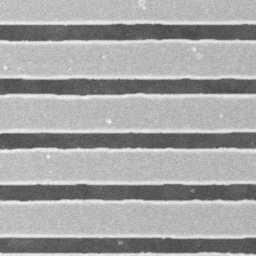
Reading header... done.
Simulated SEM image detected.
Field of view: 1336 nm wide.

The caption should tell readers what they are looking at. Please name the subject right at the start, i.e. lines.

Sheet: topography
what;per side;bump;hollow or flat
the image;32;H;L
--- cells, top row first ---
HHHHHHHHHHHHHHHHHHHHHHHHHHHHHHHH
HHHHHHHHHHHHHHHHHHHHHHHHHHHHHHHH
HHHHHHHHHHHHHHHHHHHHHHHHHHHHHHHH
LLLLLLLLLLLLLLLLLLLLLLLLLLLLLLLL
LLLLLLLLLLLLLLLLLLLLLLLLLLLLLLLL
HHHHHHHHHHHHHHHHHHHHHHHHHHHHHHHH
HHHHHHHHHHHHHHHHHHHHHHHHHHHHHHHH
HHHHHHHHHHHHHHHHHHHHHHHHHHHHHHHH
HHHHHHHHHHHHHHHHHHHHHHHHHHHHHHHH
HHHHHHHHHHHHHHHHHHHHHHHHHHHHHHHH
LLLLLLLLLLLLLLLLLLLLLLLLLLLLLLLL
LLLLLLLLLLLLLLLLLLLLLLLLLLLLLLLL
HHHHHHHHHHHHHHHHHHHHHHHHHHHHHHHH
HHHHHHHHHHHHHHHHHHHHHHHHHHHHHHHH
HHHHHHHHHHHHHHHHHHHHHHHHHHHHHHHH
HHHHHHHHHHHHHHHHHHHHHHHHHHHHHHHH
HHHHHLHHHHHHHLHHLHHLLHHHHHHHHLLL
LLLLLLLLLLLLLLLLLLLLLLLLLLLLLLLL
LLLLLLLLLLLLLLLLLLLLLLLLLLLLLLLL
HHHHHHHHHHHHHHHHHHHHHHHHHHHHHHHH
HHHHHHHHHHHHHHHHHHHHHHHHHHHHHHHH
HHHHHHHHHHHHHHHHHHHHHHHHHHHHHHHH
HHHHHHHHHHHHHHHHHHHHHHHHHHHHHHHH
LLLLLLLLLLLLLLLLLLLLLLLLLLLLLLLL
LLLLLLLLLLLLLLLLLLLLLLLLLLLLLLLL
HHHHHHHHHHHHHHHHHHHHHHHHHHHHHHHH
HHHHHHHHHHHHHHHHHHHHHHHHHHHHHHHH
HHHHHHHHHHHHHHHHHHHHHHHHHHHHHHHH
HHHHHHHHHHHHHHHHHHHHHHHHHHHHHHHH
HHHHHHHHHHHHHHHHHHHHHHHHHHHHHHHH
LLLLLLLLLLLLLLLLLLLLLLLLLLLLLLLL
LLLLLLLLLLLLLLLLLLLLLLLLLLLLLLLL